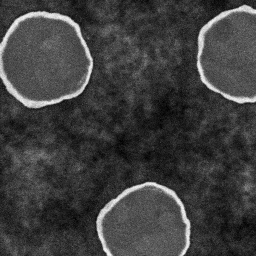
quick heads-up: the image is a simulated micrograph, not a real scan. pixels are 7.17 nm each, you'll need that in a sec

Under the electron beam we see raised bodies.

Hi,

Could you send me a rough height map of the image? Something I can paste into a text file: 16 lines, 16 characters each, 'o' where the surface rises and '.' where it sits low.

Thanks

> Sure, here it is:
................
.oooo........ooo
ooooo........ooo
oooooo......oooo
oooooo.......ooo
.oooo........ooo
..o.............
................
................
................
................
................
.......oooo.....
......oooooo....
......oooooo....
.......ooooo....